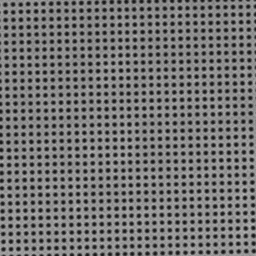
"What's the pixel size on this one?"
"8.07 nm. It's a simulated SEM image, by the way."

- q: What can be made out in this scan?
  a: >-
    a regular array of holes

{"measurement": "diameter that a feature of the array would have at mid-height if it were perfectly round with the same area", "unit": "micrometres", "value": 0.0375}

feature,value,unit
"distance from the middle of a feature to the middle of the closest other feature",58.6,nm